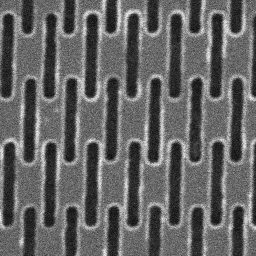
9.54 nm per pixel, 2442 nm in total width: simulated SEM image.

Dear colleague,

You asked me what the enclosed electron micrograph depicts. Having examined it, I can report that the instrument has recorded a regular array of holes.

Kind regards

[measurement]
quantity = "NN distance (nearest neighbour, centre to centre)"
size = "394 nm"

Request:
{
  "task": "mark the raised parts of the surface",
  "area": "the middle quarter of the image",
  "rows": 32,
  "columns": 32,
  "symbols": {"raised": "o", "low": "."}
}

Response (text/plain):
ooooo...ooooooo....ooooooo....oo
ooooo...ooooooo....ooooooo....oo
ooooo...ooooooo....ooooooo...ooo
o..oo...ooo..oo....ooo..oo...ooo
o..oo...ooo...o...ooo....o....oo
...oo...ooo...o...ooo....o....o.
...oo...oo....o....oo....o...ooo
...oo...oo....o....oo....o...ooo
...ooo.oooo...oo..ooo...ooo.ooo.
...oooooooo...ooooooo...ooooooo.
...ooooooo....ooooooo...ooooooo.
...ooooooo....ooooooo...ooooooo.
...ooooooo....ooooooo...ooooooo.
...ooooooo....ooooooo...ooooooo.
...ooooooo....ooooooo...ooooooo.
...ooooooo....ooooooo...ooooooo.
...ooooooo....ooooooo...ooooooo.
...ooooooo....ooooooo...ooooooo.
...ooooooo....ooooooo...ooooooo.
...ooo..oo....ooo..oo...ooo..oo.
...ooo...o....oo...oo...oo....o.
...oo....o....oo...oo...oo....o.
...oo....o...ooo...oo...oo....o.
...oo....o...ooo...oo...oo....o.
..ooo....oo.oooo...oo..ooo....oo
ooooo....ooooooo...ooooooo....oo
ooooo....ooooooo...ooooooo....oo
ooooo....ooooooo...ooooooo....oo
ooooo....ooooooo...ooooooo...ooo
ooooo....ooooooo...ooooooo...ooo
ooooo....ooooooo...ooooooo...ooo
ooooo....ooooooo...ooooooo...ooo